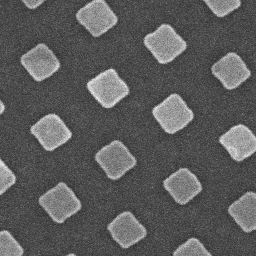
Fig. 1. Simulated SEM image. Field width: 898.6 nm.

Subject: a regular array of raised bodies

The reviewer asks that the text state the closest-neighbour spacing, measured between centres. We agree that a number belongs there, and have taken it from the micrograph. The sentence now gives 247 nm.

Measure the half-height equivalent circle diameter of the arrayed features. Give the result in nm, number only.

122